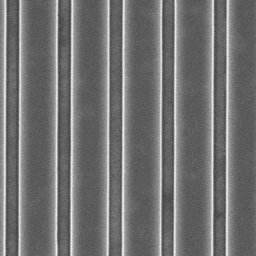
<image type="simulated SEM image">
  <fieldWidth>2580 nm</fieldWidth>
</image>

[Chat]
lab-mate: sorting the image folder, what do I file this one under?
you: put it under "parallel lines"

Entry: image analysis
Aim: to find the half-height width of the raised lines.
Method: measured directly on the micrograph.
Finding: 386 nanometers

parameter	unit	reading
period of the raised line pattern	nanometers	523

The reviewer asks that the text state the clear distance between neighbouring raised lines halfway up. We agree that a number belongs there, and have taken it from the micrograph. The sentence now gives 139 nm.